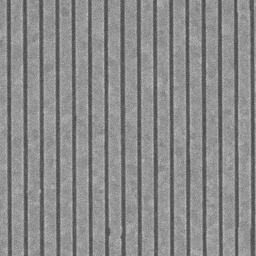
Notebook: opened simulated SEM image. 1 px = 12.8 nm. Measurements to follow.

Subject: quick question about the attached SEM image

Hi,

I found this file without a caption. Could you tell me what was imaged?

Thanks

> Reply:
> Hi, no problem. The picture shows parallel lines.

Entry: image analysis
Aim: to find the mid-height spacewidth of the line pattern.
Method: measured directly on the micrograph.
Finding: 4.5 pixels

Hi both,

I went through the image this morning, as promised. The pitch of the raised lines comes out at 208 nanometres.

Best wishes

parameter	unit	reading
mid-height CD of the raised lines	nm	149